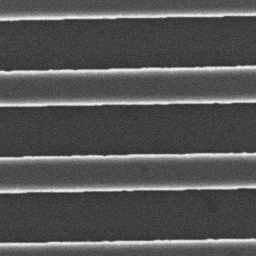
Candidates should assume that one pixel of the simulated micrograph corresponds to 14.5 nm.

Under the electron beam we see lines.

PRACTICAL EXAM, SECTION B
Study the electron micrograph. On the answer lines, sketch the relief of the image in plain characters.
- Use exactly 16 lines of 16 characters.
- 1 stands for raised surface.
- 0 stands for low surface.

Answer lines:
1111111111111111
0000000000000000
0000000000000000
0000000000000000
1111111111111111
1111111111111111
1111110000000000
0000000000000000
0000000000000000
0000000000000000
1111111111111111
1111111111111111
0000000000000000
0000000000000000
0000000000000000
1111111111111111